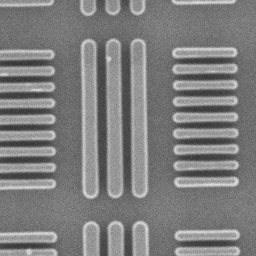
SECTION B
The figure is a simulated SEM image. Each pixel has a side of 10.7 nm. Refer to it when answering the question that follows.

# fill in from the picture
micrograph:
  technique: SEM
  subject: groups of lines, slits or small figures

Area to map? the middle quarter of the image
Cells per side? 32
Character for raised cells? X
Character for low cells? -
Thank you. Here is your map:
-----XXX---XXX---XXX--------XXXX
-----XXX---XXX---XXX--------XXXX
-----XXX---XXX---XXX------------
-----XXX---XXX---XXX------------
-----XXX---XXX---XXX--------XXXX
-----XXX---XXX---XXX--------XXXX
-----XXX---XXX---XXX------------
-----XXX---XXX---XXX------------
-----XXX---XXX---XXX--------XXXX
-----XXX---XXX---XXX--------XXXX
-----XXX---XXX---XXX------------
-----XXX---XXX---XXX------------
-----XXX---XXX---XXX--------XXXX
-----XXX---XXX---XXX--------XXXX
-----XXX---XXX---XXX--------XX--
-----XXX---XXX---XXX------------
-----XXX---XXX---XXX--------XXXX
-----XXX---XXX---XXX--------XXXX
-----XXX---XXX---XXXX-----------
-----XXX---XXX---XXXX-----------
-----XXX---XXX---XXXX-------XXXX
-----XXX---XXX---XXXX-------XXXX
-----XXX---XXX---XXXX-----------
-----XXX---XXX---XXXX-----------
-----XXX---XXX---XXXX-------XXXX
-----XXX---XXX---XXXX-------XXXX
-----XXX---XXX---XXXX-----------
-----XXX---XXX---XXXX-----------
-----XXX---XXX---XXXX-----------
-----XXX---XXX---XXXX-------XXXX
-----XXX---XXX---XXXX-----------
-----XXX---XXX---XXXX-----------